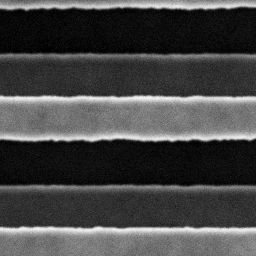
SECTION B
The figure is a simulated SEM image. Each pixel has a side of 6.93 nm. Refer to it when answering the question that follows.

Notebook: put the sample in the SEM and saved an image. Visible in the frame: lines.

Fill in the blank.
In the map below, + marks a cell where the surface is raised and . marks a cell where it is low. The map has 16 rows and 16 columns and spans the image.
++..............
................
................
++++++++++++++++
++++++++++++++++
++++++++++++++++
++++++++++++++++
++++++++++++++++
++++++++++++++++
................
................
................
++++++++++++++++
++++++++++++++++
++++++++++++++++
++++++++++++++++